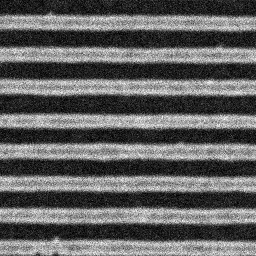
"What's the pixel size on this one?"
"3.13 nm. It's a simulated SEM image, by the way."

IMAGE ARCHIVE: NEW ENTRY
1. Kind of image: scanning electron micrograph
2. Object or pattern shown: parallel lines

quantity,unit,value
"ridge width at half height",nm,36.4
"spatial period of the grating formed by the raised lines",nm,101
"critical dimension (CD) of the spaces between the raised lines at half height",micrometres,0.0645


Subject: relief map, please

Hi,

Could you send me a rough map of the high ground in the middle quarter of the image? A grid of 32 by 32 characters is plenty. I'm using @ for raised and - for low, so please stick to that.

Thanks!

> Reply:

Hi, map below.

--------------------------------
--------------------------------
--------------------------------
--------------------------------
-----@@@@@@--@@@@-@@@@@@@@@-----
@@@@@@@@@@@@@@@@@@@@@@@@@@@@@@@@
@@@@@@@@@@@@@@@@@@@@@@@@@@@@@@@@
--------------------------------
--------------------------------
--------------------------------
--------------------------------
--------------------------------
--------------------------------
@@@@@@@@@@@@@@@@@@@@@@@@@@@@@@@@
@@@@@@@@@@@@@@@@@@@@@@@@@@@@@@@@
@@@@@@@@@@@@@@@@@@@@@@@@@@@@@@@@
--------------------------------
--------------------------------
--------------------------------
--------------------------------
@@@@@@@@@@@@@@@@@-----------@@--
@@@@@@@@@@@@@@@@@@@@@@@@@@@@@@@@
@@@@@@@@@@@@@@@@@@@@@@@@@@@@@@@@
--------@@@@--------------------
--------------------------------
--------------------------------
--------------------------------
--------------------------------
--------------------------------
@@@@@@@@@@@@@@@@@@@@@@@@@@@@@@@@
@@@@@@@@@@@@@@@@@@@@@@@@@@@@@@@@
-------------------------------@